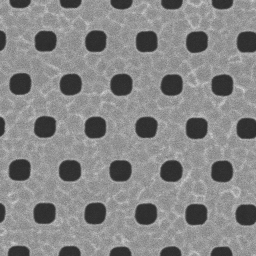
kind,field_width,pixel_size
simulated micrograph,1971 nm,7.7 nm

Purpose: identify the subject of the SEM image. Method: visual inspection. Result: a regular array of holes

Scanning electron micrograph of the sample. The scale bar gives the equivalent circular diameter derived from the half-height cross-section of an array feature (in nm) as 174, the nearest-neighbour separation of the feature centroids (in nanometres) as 383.